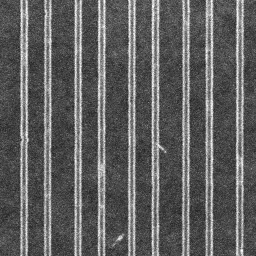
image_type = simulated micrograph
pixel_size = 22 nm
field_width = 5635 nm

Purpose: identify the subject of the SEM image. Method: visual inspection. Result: parallel lines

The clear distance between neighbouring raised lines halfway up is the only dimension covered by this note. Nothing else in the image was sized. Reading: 442 nanometers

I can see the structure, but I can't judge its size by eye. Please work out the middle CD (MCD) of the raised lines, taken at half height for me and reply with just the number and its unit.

132 nm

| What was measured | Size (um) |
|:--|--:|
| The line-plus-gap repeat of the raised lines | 0.594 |